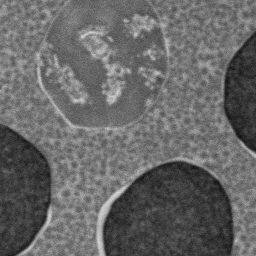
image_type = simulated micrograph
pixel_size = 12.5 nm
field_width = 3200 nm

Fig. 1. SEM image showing holes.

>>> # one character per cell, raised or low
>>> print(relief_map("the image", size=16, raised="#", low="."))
################
################
###############.
##############..
##############..
##############..
##############..
##############..
.##############.
...#############
...#######...###
...#####......##
...####.......##
...###.........#
...###.........#
..####.........#